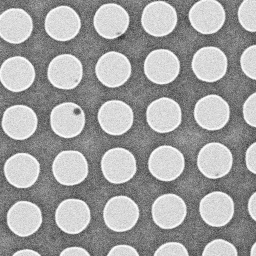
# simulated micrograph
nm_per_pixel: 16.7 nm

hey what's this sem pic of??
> an array of small figures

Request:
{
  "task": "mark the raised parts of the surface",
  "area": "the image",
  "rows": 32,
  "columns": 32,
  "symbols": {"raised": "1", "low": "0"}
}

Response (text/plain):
00000000000000000001100011100011
01100011100011110011110011110011
11110011110011110011110011110011
11110011110011110011110011100001
11110011100001100000000000000000
00000000000000000000000000000000
00000000000000000001100001110001
01100001110011110011110011110011
11110011110011110011110011110011
11110011110011110011110001110001
11110001110001100000000000000000
00000000000000000000000000000000
00000000000000000000100001110001
01110001110001110001110011111001
11110011110011111011111011111001
11111011110001110001110001110001
01110001110001110000000000000000
00000000000000000000000000000000
00000000000000000000110001110001
00110001110001111001111001111001
01111001111001111001111001111001
01111001111001111001111001110000
01110001110000110000100000000000
00000000000000000000000000000000
00000000000000000000110000110000
00110000111001111001111001111001
01111001111001111001111001111001
01111001111001111001111000111000
01111000111000110000000000000000
00000000000000000000000000000000
00000000000000000000010000111000
00110000111000111000111001111101